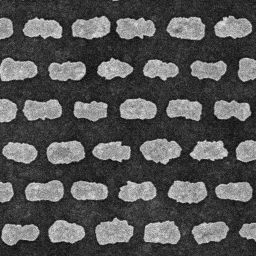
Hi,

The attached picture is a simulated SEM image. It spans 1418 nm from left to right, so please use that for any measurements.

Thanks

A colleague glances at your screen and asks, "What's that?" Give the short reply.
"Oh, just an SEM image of a regular array of raised bodies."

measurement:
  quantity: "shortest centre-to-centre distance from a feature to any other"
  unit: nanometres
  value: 255